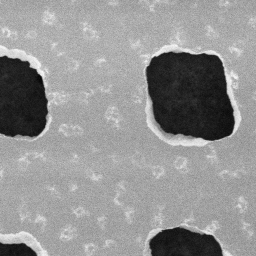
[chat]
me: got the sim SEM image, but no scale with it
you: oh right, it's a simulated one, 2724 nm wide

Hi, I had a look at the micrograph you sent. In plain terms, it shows holes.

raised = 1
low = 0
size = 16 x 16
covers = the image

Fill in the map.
1111111111111111
1111111111111111
1111111111111111
1111111111000111
0011111110000011
0001111110000011
0001111110000011
0001111111000001
0011111111000011
1111111111111111
1111111111111111
1111111111111111
1111111111111111
1111111111111111
1111111111000111
0011111110000011